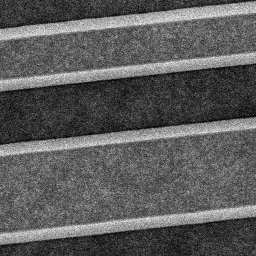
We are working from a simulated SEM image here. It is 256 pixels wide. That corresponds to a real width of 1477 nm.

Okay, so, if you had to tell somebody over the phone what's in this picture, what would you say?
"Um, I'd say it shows one or a few lines or trenches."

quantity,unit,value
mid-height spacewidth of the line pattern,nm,365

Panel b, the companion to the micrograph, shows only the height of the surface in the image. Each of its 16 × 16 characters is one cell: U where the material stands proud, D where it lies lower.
DDDDDDDDDDDDDDDU
DDDDDDUUUUUUUUUU
UUUUUUUUUUUUUUUU
UUUUUUUUUUUUUUUU
UUUUUUUUDDDDDDDD
DDDDDDDDDDDDDDDD
DDDDDDDDDDDDDDDD
DDDDDDDDDDDDDDDD
DDDDDDDDUUUUUUUU
UUUUUUUUUUUUUUUU
UUUUUUUUUUUUUUUU
UUUUUUUUUUUUUUUU
UUUUUUUUUUUUUUUU
UUUUUUUUUUUUUUDD
UUUUDDDDDDDDDDDD
DDDDDDDDDDDDDDDD